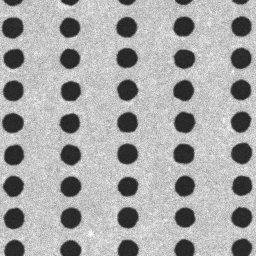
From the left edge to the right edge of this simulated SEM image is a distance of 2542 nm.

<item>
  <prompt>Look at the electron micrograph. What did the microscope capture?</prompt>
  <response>a regular array of holes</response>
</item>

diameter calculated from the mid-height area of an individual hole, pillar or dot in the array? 207 nm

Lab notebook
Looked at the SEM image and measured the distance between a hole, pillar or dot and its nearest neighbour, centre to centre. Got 0.313 µm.